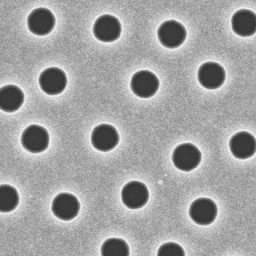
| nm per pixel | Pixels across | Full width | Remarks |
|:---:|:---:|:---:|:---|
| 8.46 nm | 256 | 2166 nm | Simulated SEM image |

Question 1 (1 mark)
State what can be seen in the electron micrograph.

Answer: a regular array of holes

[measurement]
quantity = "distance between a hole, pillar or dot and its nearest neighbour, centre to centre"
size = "0.512 um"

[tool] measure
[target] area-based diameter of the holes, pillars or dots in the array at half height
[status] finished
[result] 224 nm